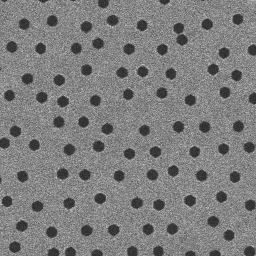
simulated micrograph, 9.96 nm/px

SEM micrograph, a regular array of holes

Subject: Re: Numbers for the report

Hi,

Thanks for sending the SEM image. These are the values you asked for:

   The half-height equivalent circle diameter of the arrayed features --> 0.114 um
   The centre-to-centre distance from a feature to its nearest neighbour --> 235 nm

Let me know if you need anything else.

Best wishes